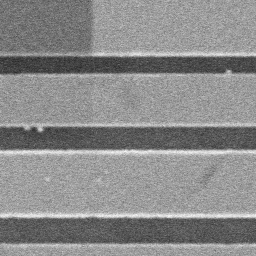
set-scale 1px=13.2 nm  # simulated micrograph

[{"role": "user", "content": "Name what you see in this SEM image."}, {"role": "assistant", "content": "lines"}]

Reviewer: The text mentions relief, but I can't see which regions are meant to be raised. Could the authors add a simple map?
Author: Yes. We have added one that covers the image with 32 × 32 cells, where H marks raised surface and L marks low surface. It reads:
HHHHHHHHHHHHHHHHHHHHHHHHHHHHHHHH
HHHHHHHHHHHHHHHHHHHHHHHHHHHHHHHH
HHHHHHHHHHHHHHHHHHHHHHHHHHHHHHHH
HHHHHHHHHHHHHHHHHHHHHHHHHHHHHHHH
HHHHHHHHHHHHHHHHHHHHHHHHHHHHHHHH
HHHHHHHHHHHHHHHHHHHHHHHHHHHHHHHH
HHHHHHHHHHHHHHHHHHHHHHHHHHHHHHHH
LLLLLLLLLLLLLLLLLLLLLLLLLLLLLLLL
LLLLLLLLLLLLLLLLLLLLLLLLLLLLLLLL
HHHHHHHHHHHHHHHHHHHHHHHHHHHHHHHH
HHHHHHHHHHHHHHHHHHHHHHHHHHHHHHHH
HHHHHHHHHHHHHHHHHHHHHHHHHHHHHHHH
HHHHHHHHHHHHHHHHHHHHHHHHHHHHHHHH
HHHHHHHHHHHHHHHHHHHHHHHHHHHHHHHH
HHHHHHHHHHHHHHHHHHHHHHHHHHHHHHHH
HHHHHHHHHHHHHHHHHHHHHHHHHHHHHHHH
LLLLLLLLLLLLLLLLLLLLLLLLLLLLLLLL
LLLLLLLLLLLLLLLLLLLLLLLLLLLLLLLL
LLLLLLLLLLLLLLLLLLLLLLLLLLLLLLLL
HHHHHHHHHHHHHHHHHHHHHHHHHHHHHHHH
HHHHHHHHHHHHHHHHHHHHHHHHHHHHHHHH
HHHHHHHHHHHHHHHHHHHHHHHHHHHHHHHH
HHHHHHHHHHHHHHHHHHHHHHHHHHHHHHHH
HHHHHHHHHHHHHHHHHHHHHHHHHHHHHHHH
HHHHHHHHHHHHHHHHHHHHHHHHHHHHHHHH
HHHHHHHHHHHHHHHHHHHHHHHHHHHHHHHH
HHHHHHHHHHHHHHHHHHHHHHHHHHHHHHHH
LLLLLLLLLLLLLLLLLLLLLLLLLLLLLLLL
LLLLLLLLLLLLLLLLLLLLLLLLLLLLLLLL
LLLLLLLLLLLLLLLLLLLLLLLLLLLLLLLL
LLLLLLLLLLLLLLLLLLLLLLLLLLLLLLLL
HHHHHHHHHHHHHHHHHHHHHHHHHHHHHHHH